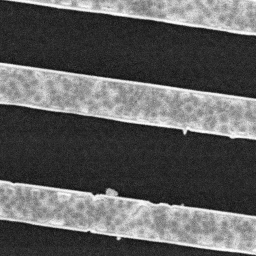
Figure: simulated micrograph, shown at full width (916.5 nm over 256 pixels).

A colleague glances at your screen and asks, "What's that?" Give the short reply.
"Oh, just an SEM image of one or a few lines or trenches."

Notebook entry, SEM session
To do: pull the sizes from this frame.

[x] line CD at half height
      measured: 132 nanometers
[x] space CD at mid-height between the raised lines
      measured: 277 nanometers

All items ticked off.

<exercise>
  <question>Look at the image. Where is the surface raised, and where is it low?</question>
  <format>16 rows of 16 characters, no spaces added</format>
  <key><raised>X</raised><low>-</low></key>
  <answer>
----XXXXXXXXXXXX
-----------XXXXX
----------------
----------------
XXXX------------
XXXXXXXXXXX-----
-XXXXXXXXXXXXXXX
--------XXXXXXXX
--------------XX
----------------
----------------
X---------------
XXXXXXXX--------
XXXXXXXXXXXXXXX-
------XXXXXXXXXX
-------------XXX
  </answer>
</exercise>